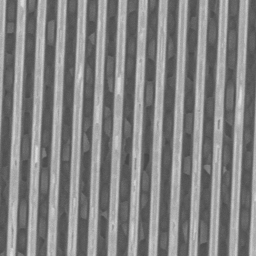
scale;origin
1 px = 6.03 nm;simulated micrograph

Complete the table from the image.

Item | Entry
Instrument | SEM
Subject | parallel lines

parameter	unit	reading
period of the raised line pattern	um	0.122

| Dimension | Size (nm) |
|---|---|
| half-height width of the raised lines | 48.2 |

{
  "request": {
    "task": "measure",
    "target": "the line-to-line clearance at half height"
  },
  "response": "73.8 nanometres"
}